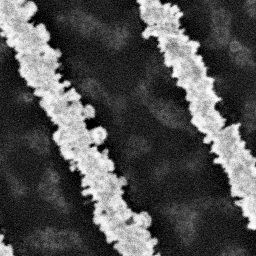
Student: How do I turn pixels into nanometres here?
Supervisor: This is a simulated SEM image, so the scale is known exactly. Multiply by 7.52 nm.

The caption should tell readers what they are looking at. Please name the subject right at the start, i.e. one or a few lines or trenches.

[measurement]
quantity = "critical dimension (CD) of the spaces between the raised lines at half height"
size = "743 nm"